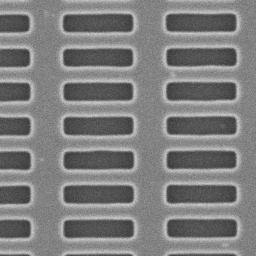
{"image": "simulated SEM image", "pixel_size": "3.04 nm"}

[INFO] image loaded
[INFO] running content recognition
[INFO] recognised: groups of lines, slits or small figures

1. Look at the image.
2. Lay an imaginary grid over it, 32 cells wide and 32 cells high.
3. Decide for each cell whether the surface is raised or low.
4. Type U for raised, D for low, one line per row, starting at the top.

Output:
UUUUUUUUUUUUUUUUUUUUUUUUUUUUUUUU
UUUUUUUUUUUUUUUUUUUUUUUUUUUUUUUU
DDDDUUUUDDDDDDDDDUUUUDDDDDDDDDUU
DDDDUUUUDDDDDDDDDUUUUDDDDDDDDUUU
UUUUUUUUUUUUUUUUUUUUUUUUUUUUUUUU
UUUUUUUUUUUUUUUUUUUUUUUUUUUUUUUU
DDDDUUUUDDDDDDDDDUUUUDDDDDDDDUUU
DDDDUUUUDDDDDDDDDUUUUDDDDDDDDDUU
UUUUUUUUUUUUUUUUUUUUUUUUUUUUUUUU
UUUUUUUUUUUUUUUUUUUUUUUUUUUUUUUU
DDDUUUUUDDDDDDDDUUUUUDDDDDDDDUUU
DDDDUUUUDDDDDDDDDUUUUDDDDDDDDDUU
DDDUUUUUDDDDDDDDUUUUUDDDDDDDDUUU
UUUUUUUUUUUUUUUUUUUUUUUUUUUUUUUU
UUUUUUUUUUUUUDDDUUUUUUDDDDDDDUUU
DDDDUUUUDDDDDDDDDUUUUDDDDDDDDDUU
DDDDUUUUDDDDDDDDDUUUUDDDDDDDDUUU
UUUUUUUUUUUUUUUUUUUUUUUUUUUUUUUU
UUUUUUUUUUUUUUUUUUUUUUUUUUUUUUUU
DDDDUUUUDDDDDDDDDUUUUDDDDDDDDDUU
DDDDUUUUDDDDDDDDDUUUUDDDDDDDDDUU
UUUUUUUUUUUUUUUUUUUUUUUUUUUUUUUU
UUUUUUUUUUUUUUUUUUUUUUUUUUUUUUUU
DDDDUUUUDDDDDDDDDUUUUDDDDDDDDUUU
DDDDUUUUDDDDDDDDDUUUUDDDDDDDDDUU
DDDUUUUUUUDUUUUUUUUUUUUUUUUUUUUU
UUUUUUUUUUUUUUUUUUUUUUUUUUUUUUUU
DDDUUUUUDDDDDDDDUUUUUDDDDDDDDUUU
DDDDUUUUDDDDDDDDDUUUUDDDDDDDDDUU
DDDDUUUUDDDDDDDDUUUUUDDDDDDDDUUU
UUUUUUUUUUUUUUUUUUUUUUUUUUUUUUUU
UUUUUUUUUUUUUUUUUUUUUUUUUUUUUUUU